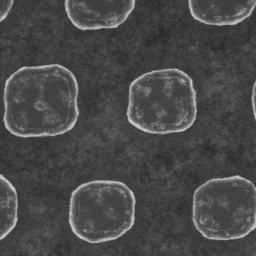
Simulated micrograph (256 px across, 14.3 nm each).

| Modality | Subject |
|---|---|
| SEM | raised bodies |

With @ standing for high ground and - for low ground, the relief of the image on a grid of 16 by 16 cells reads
@---@@@@----@@@@
-----@@------@--
----------------
----------------
-@@@-----@@-----
@@@@@---@@@@----
@@@@@---@@@@----
@@@@@---@@@@----
-@--------------
----------------
----------------
@----@@@-----@@@
@---@@@@----@@@@
@---@@@@----@@@@
-----@@@-----@@@
----------------